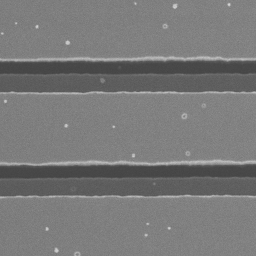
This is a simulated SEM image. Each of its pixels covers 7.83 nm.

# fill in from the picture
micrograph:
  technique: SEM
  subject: lines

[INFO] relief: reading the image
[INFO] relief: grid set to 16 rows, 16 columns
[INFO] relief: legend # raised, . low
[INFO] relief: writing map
################
################
################
################
................
................
################
################
################
################
................
................
################
################
################
################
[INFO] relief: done